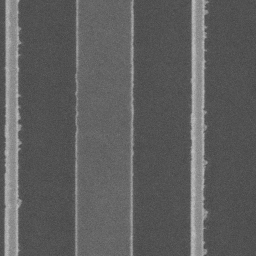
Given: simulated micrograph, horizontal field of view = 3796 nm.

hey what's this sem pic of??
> lines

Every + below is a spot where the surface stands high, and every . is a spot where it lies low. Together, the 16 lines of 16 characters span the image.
.....+++........
.....+++........
.....+++........
.....+++........
.....+++........
.....+++........
.....+++........
.....+++........
.....+++........
.....+++........
.....+++........
.....+++........
.....+++........
.....+++........
.....+++........
.....+++........